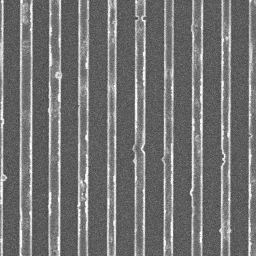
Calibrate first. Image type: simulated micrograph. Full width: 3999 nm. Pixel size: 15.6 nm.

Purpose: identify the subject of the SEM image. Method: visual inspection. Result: parallel lines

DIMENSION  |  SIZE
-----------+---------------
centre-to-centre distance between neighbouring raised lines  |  446 nanometers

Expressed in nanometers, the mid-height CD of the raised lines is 146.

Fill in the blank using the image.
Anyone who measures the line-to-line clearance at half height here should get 0.307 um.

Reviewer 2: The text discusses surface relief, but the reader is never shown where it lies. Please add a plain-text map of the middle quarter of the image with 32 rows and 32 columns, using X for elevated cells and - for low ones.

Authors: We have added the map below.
----XX-----XX-----XX-----XX-----
----XX-----XX-----XX-----XX-----
----XX-----XX-----XX-----XX-----
----XX-----XX-----XX-----XX-----
----XX-----XX-----XX-----XX-----
----XX-----XX-----XX-----XX-----
----XX-----XX-----XX-----XX-----
----XX-----XX-----XX-----XX-----
----XX-----XX-----XX-----XX-----
----XX-----XX-----XX-----XX-----
----XX-----XX-----XX-----XX-----
----XX-----XX-----XX-----XX-----
----XX-----XX-----XX-----XX-----
----XX-----XX-----XX-----XX-----
----XX-----XX-----XX-----XX-----
----XX-----XX-----XX-----XX-----
----XX-----XX-----XX-----XX-----
----XX-----XX-----XX-----XX-----
----XX-----XX-----XX-----XX-----
----XX-----XX-----XX-----XX-----
----XX-----XX----XXX-----XX-----
----XX-----XX----XXX-----XX-----
----XX-----XX-----XX-----XX-----
----XX-----XX-----XX-----XX-----
----XX-----XX----XXX-----XX-----
----XX-----XX-----XX-----XX-----
----XX-----XX-----XX-----XX-----
----XX-----XX-----XX-----XX-----
----XX-----XX-----XX-----XX-----
----XX-----XX-----XX-----XX-----
----XX-----XX-----XX-----XX-----
----XX-----XX-----XX-----XX-----